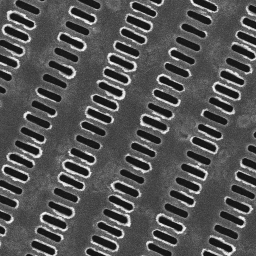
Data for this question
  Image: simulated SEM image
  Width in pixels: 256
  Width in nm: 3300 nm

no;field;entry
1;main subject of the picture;a regular array of holes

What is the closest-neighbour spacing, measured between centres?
184 nanometres